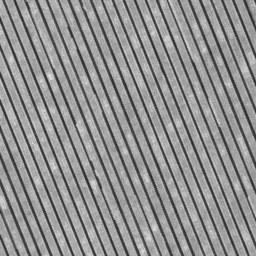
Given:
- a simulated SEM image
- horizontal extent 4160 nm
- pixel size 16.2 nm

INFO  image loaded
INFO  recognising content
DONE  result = parallel lines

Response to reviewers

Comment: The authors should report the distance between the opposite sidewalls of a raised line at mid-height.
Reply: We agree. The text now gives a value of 121 nanometres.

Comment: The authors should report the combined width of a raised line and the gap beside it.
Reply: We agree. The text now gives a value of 165 nanometres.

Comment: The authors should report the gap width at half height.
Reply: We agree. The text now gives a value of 45.3 nm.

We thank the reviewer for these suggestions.